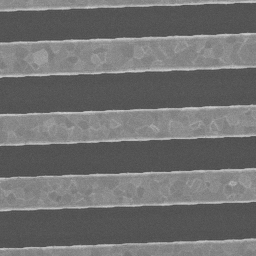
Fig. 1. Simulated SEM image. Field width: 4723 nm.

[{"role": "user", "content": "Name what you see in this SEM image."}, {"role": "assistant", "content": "lines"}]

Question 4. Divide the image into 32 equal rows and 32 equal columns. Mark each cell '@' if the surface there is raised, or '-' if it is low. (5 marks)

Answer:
@@@@@@@@@@@@@@@@@@@@@@@@@-------
--------------------------------
--------------------------------
--------------------------------
------------------------@@@@@@@@
@@@@@@@@@@@@@@@@@@@@@@@@@@@@@@@@
@@@@@@@@@@@@@@@@@@@@@@@@@@@@@@@@
@@@@@@@@@@@@@@@@@@@@@@@@@@@@@@@@
@@@@@@@@@@@@@@@@@@@@@@@@@@@-----
@@@-----------------------------
--------------------------------
--------------------------------
--------------------------------
-----------------------@@@@@@@@@
@@@@@@@@@@@@@@@@@@@@@@@@@@@@@@@@
@@@@@@@@@@@@@@@@@@@@@@@@@@@@@@@@
@@@@@@@@@@@@@@@@@@@@@@@@@@@@@@@@
@@@@@@@@@@@@@@@@@@--------------
--------------------------------
--------------------------------
--------------------------------
----------------------@@@@@@@@@@
@@@@@@@@@@@@@@@@@@@@@@@@@@@@@@@@
@@@@@@@@@@@@@@@@@@@@@@@@@@@@@@@@
@@@@@@@@@@@@@@@@@@@@@@@@@@@@@@@@
@@@@@@@@@@@@@@@@@@@@@@----------
--------------------------------
--------------------------------
--------------------------------
--------------------------------
---------------@@@@@@@@@@@@@@@@@
@@@@@@@@@@@@@@@@@@@@@@@@@@@@@@@@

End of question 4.